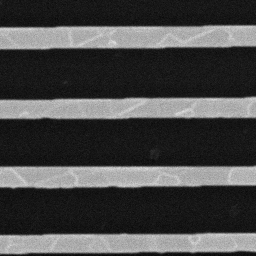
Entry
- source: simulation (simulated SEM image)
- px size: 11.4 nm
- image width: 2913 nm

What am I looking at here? lines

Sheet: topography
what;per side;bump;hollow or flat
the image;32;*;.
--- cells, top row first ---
................................
................................
................................
.......*************************
********************************
********************************
................................
................................
................................
................................
................................
................................
.......*************************
********************************
********************************
................................
................................
................................
................................
................................
................................
********************************
********************************
................................
................................
................................
................................
................................
................................
********************************
********************************
******************......*.......